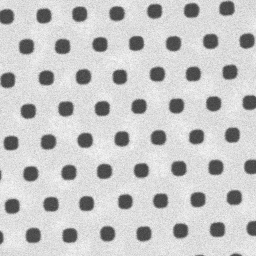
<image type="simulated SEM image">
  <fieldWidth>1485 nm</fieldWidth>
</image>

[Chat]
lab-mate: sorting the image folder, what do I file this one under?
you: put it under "a regular array of holes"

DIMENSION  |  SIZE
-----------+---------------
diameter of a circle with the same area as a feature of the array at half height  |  92.4 nanometers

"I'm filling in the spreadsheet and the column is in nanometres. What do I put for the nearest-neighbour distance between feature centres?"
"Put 207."